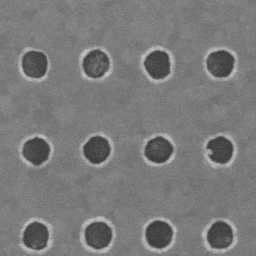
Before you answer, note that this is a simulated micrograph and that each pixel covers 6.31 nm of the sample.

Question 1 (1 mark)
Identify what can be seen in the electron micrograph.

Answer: a regular array of holes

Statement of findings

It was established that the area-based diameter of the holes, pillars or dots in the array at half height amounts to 182 nanometres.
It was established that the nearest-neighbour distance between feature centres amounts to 385 nanometres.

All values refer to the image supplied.